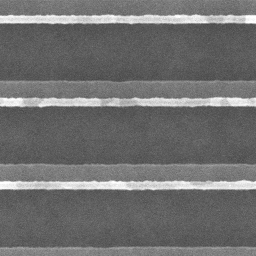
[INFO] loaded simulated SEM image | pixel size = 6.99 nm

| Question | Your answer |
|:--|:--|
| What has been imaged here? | lines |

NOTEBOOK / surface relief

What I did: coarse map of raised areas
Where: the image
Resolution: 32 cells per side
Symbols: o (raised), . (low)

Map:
oooooooooooooooooooooooooooooooo
oooooooooooooooooooooooooooooooo
oooooooooooooooooooooooooooooooo
................................
................................
................................
................................
................................
................................
................................
oooooooooooooooooooooooooooooooo
oooooooooooooooooooooooooooooooo
oooooooooooooooooooooooooooooooo
................................
................................
................................
................................
................................
................................
................................
................................
oooooooooooooooooooooooooooooooo
oooooooooooooooooooooooooooooooo
oooooooooooooooooooooooooooooooo
................................
................................
................................
................................
................................
................................
................................
oooooooooooooooooooooooooooooooo